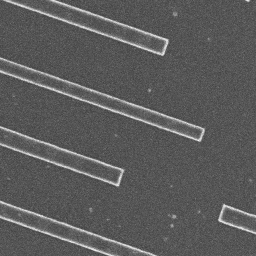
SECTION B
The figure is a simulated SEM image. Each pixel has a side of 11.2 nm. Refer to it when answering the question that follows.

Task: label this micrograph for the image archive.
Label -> one or a few lines or trenches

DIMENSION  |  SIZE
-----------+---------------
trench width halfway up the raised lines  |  0.606 micrometres